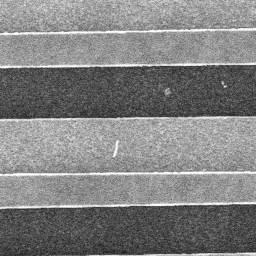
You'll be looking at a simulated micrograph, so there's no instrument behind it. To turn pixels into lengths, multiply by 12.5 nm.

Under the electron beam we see lines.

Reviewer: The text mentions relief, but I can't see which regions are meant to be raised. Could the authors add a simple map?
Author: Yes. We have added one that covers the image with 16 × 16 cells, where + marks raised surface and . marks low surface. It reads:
++++++++++++++++
++++++++++++++++
++++++++++++++++
++++++++++++++++
................
................
................
++++++++++++++++
++++++++++++++++
++++++++++++++++
++++++++++++++++
++++++++++++++++
++++++++++++++++
................
................
................